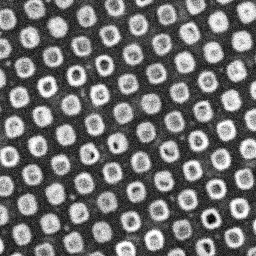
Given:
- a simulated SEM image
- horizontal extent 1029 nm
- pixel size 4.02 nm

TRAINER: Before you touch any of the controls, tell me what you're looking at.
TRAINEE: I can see a regular array of raised bodies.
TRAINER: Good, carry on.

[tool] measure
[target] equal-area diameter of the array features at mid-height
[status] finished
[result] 73 nm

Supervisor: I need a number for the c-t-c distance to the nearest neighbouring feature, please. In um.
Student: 0.119